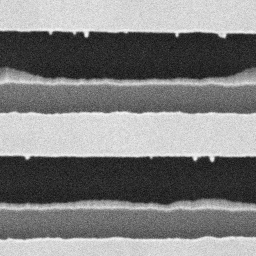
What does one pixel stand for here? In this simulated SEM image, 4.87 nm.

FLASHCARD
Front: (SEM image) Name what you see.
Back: lines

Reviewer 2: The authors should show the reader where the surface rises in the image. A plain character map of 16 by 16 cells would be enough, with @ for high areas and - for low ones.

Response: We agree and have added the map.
@@@@@@@@@@@@@@@@
@@@@@@@@@@@@@@@@
----------------
----------------
----------------
@@@@@@@@@@@@@@@@
@@@@@@@@@@@@@@@@
@@@@@@@@@@@@@@@@
@@@@@@@@@@@@@@@@
@@@@@@@@@@@@@@@@
----------------
----------------
----------------
@@@@@@@@@@@@@@@@
@@@@@@@@@@@@@@@@
@@@@@@@@@@@@@@@@